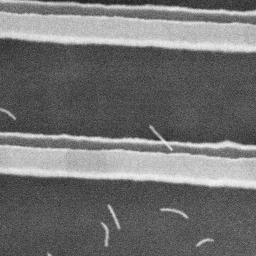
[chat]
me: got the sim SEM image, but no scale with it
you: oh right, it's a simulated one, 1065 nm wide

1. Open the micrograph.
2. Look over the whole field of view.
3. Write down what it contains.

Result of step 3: lines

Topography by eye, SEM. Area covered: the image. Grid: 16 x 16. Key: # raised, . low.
###########.....
################
......##########
................
................
................
................
................
####............
################
################
................
................
................
................
................